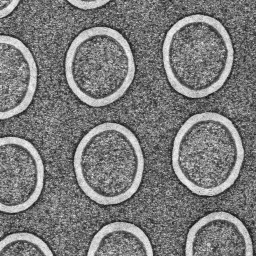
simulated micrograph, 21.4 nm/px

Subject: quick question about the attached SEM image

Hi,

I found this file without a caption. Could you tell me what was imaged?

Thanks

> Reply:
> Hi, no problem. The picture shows raised bodies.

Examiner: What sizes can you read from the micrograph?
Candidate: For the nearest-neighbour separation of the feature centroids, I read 2110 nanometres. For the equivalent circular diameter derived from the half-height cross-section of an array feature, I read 1480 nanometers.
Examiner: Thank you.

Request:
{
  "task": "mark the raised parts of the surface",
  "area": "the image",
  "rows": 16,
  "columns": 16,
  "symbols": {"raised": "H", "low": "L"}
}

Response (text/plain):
HLLLLLLLLLLLLLLL
LLLLLLLLLLLHHLLL
LLLLLHHHLLLHHHLL
HHLLHHHHLLHHHHLL
HHLLHHHHLLLHHHLL
HHLLLHHHLLLHHLLL
HLLLLLLLLLLLLLLL
LLLLLLLLLLLLHHLL
LLLLLLHHLLLHHHHL
HHLLLHHHHLLHHHHL
HHHLLHHHHLLHHHHL
HHLLLHHHLLLLHHLL
HHLLLLHLLLLLLLLL
LLLLLLLLLLLLLLLL
LLLLLLLHHLLLHHHL
HHHLLLHHHLLLHHHH